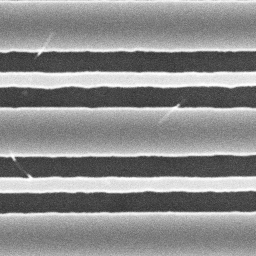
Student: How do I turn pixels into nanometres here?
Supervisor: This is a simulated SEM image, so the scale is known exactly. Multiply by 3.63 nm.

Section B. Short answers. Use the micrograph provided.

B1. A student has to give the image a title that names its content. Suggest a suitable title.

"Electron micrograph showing lines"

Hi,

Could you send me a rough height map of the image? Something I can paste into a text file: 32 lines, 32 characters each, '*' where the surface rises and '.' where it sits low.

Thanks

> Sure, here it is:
********************************
********************************
********************************
********************************
********************************
********************************
*..***..........................
................................
................................
********************************
********************************
................................
................................
.....................**.........
********************************
********************************
********************************
********************************
********************************
******************..***.........
................................
................................
********************************
********************************
................................
................................
.....................*..........
********************************
********************************
********************************
********************************
********************************